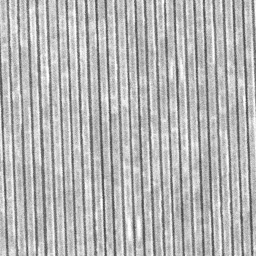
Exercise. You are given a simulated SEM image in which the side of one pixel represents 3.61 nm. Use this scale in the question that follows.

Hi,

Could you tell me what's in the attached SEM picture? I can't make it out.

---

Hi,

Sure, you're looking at parallel lines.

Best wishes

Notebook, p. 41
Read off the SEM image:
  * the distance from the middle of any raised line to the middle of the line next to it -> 35.4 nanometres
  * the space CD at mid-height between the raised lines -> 9.5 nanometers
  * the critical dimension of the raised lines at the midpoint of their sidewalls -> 25.3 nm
